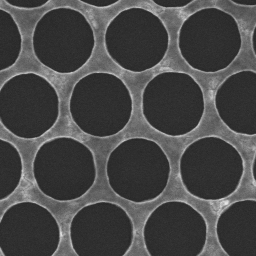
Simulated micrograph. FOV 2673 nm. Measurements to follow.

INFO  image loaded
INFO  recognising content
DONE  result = a regular array of holes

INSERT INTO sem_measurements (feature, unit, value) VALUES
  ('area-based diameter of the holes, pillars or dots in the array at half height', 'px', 62.9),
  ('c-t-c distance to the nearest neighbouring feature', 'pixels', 73.1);